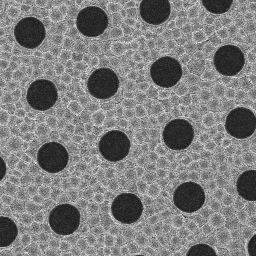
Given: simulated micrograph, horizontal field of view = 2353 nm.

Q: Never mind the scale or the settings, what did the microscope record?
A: a regular array of holes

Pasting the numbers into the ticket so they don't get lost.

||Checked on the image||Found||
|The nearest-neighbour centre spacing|578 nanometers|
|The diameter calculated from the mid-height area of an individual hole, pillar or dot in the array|282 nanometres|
